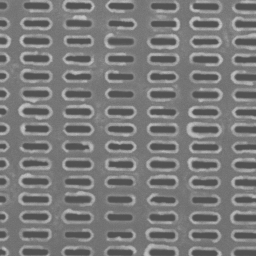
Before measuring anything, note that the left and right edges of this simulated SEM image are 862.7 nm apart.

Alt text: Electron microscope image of a regular array of holes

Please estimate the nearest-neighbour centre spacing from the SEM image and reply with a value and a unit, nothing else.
58.6 nm